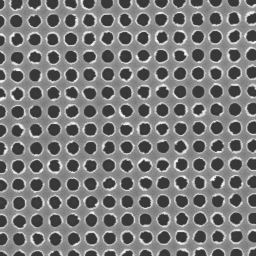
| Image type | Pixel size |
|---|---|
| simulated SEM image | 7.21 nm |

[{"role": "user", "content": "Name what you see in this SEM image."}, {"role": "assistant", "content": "a regular array of holes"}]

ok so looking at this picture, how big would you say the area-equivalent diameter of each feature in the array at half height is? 86.8 nanometers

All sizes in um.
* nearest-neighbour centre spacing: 0.127